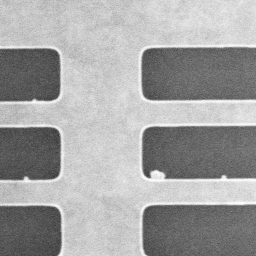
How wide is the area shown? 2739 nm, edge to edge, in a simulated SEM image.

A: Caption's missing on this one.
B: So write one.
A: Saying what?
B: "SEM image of groups of lines, slits or small figures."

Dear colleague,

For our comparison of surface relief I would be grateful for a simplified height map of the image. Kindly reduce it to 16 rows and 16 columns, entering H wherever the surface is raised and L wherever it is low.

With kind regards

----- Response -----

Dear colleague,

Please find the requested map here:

HHHHHHHHHHHHHHHH
HHHHHHHHHHHHHHHH
HHHHHHHHHHHHHHHH
LLLLHHHHHLLLLLLL
LLLLHHHHHLLLLLLL
LLLLHHHHHLLLLLLL
HHHHHHHHHHHHHHHH
HHHHHHHHHHHHHHHH
LLLLHHHHHLLLLLLL
LLLLHHHHHLLLLLLL
LLLLHHHHHLLLLLLL
HHHHHHHHHHHHHHHH
HHHHHHHHHHHHHHHH
LLLLHHHHHLLLLLLL
LLLLHHHHHLLLLLLL
LLLLHHHHHLLLLLLL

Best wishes